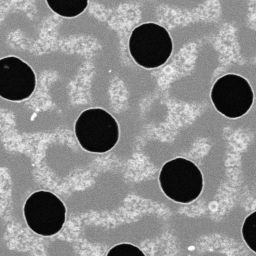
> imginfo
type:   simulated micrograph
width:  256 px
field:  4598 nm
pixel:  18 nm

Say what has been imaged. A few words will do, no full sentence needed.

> holes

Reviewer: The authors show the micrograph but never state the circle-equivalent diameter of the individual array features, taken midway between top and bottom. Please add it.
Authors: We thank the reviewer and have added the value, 0.785 um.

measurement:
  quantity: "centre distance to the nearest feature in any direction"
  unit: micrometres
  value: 1.75